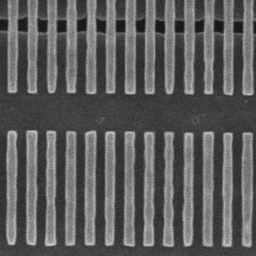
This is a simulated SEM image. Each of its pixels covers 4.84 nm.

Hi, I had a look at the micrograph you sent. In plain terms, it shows wiring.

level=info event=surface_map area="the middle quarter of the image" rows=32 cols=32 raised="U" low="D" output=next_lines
DUUDDDUUDDDUUDDUUUDDUUUDDUUDDDDU
DUUDDDUUDDDUUDDUUUDDUUUDDUUDDDUU
DUUDDDUUDDDUUDDUUUDDUUUDDUUDDDUU
DUUDDDUUDDDUUDDUUUDDUUUDDUUDDDUU
DUUDDDUUDDDUUDDUUUDDUUDDDUUDDDUU
DUUDDDUUDDDUUDDUUUDDUUDDDUUDDDDU
DUUDDDUUDDDUUDDUUUDDUUUDDDUDDDUU
DDDDDDDDDDDDDDDDDDDDDDDDDDDDDDDD
DDDDDDDDDDDDDDDDDDDDDDDDDDDDDDDD
DDDDDDDDDDDDDDDDDDDDDDDDDDDDDDDD
DDDDDDDDDDDDDDDDDDDDDDDDDDDDDDDD
DDDDDDDDDDDDDDDDDDDDDDDDDDDDDDDD
DDDDDDDDDDDDDDDDDDDDDDDDDDDDDDDD
DDDDDDDDDDDDDDDDDDDDDDDDDDDDDDDD
DDDDDDDDDDDDDDDDDDDDDDDDDDDDDDDD
DDDDDDDDDDDDDDDDDDDDDDDDDDDDDDDD
DDDDDDDDDDDDDDDDDDDDDDDDDDDDDDDD
DUUDDDUUDDDUUDDUUDDDUUDDDUUDDDDU
DUUDDDUUDDDUUDDUUDDDUUUDDUUDDDUU
DUUDDDUUDDDUUDDUUDDDUUDDDUUDDDUU
DUUDDDUUDDDUDDDUUDDDDUDDDUUDDDUU
DUUDDDUUDDUUUDDUUDDDUUDDDUUDDDUU
DUUDDDUUDDUUUDDUUDDDUUDDDUUDDDUU
DUUDDDUUDDUUUDDUUDDDUUDDDUUDDDUU
DUUDDDUUDDUUUDDUUDDDDUDDDUUDDDUU
DUUDDDUUDDUUUDDUUDDDDUDDDDUDDDUU
DUUDDDUUDDUUUDDUUDDDUUDDDUUDDDUU
DUUDDDUUDDUUUDDUUDDDUUDDDUUDDDUU
DUUDDDUUDDUUUDDUUDDDUUDDDUUDDDUU
UUUDDDUUDDUUUDDUUDDDUUDDDUUDDDUU
UUUDDDUUDDUUUDDUUDDDUUDDDUUDDDUU
UUUDDDUUDDUUDDDUUDDDUUDDDUUDDDUU